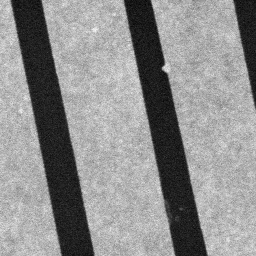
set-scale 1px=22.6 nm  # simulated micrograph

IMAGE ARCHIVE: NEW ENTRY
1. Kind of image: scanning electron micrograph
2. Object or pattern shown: lines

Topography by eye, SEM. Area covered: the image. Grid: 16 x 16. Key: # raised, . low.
#..#####..#####.
#..#####..#####.
#..#####..#####.
#..#####..#####.
##..#####.#####.
##..#####..#####
##..#####..#####
##..#####..#####
##..#####..#####
###..#####..####
###..#####..####
###..#####..####
###..#####..####
###..#####..####
####..#####..###
####..#####..###